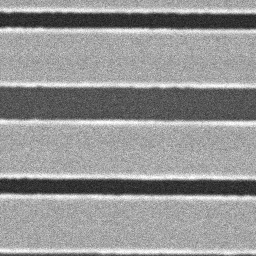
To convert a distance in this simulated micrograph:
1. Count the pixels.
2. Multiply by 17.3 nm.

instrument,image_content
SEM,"lines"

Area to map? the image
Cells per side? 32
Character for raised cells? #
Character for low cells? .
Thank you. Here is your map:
################################
...............####.#.##########
................................
................................
################################
################################
################################
################################
################################
################################
################################
................................
................................
................................
................................
################################
################################
################################
################################
################################
################################
################################
................................
................................
##############.####.............
################################
################################
################################
################################
################################
################################
################################